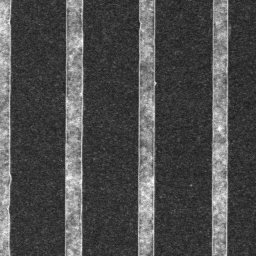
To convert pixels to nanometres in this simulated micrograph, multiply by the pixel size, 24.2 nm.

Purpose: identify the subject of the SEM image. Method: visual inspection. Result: one or a few lines or trenches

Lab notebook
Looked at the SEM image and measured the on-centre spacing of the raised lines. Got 1760 nanometres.